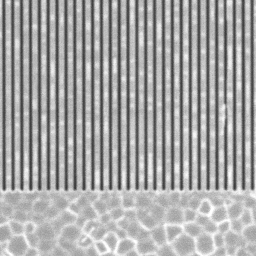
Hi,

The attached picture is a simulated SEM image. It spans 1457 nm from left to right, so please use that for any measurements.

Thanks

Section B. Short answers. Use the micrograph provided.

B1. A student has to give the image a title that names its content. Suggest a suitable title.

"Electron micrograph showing parallel lines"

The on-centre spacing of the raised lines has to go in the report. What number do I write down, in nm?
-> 50.5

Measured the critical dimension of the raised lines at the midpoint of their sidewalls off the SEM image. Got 32.7 nanometers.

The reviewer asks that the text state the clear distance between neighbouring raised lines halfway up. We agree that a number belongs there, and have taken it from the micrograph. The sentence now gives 16.4 nm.